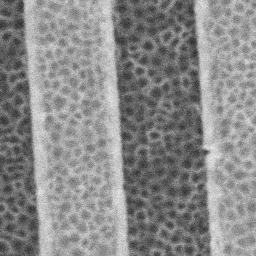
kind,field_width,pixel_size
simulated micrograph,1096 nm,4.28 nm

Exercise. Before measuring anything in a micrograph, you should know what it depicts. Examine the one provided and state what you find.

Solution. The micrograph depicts one or a few lines or trenches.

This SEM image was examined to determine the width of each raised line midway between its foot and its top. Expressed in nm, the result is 337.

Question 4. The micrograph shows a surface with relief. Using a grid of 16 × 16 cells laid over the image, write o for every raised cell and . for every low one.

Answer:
..ooooo.....oooo
..ooooo......ooo
..ooooo......ooo
..ooooo......ooo
..ooooo......ooo
..ooooo......ooo
..ooooo......ooo
..ooooo......ooo
..ooooo......ooo
..ooooo......ooo
..ooooo......ooo
...oooo......ooo
...ooooo.....ooo
...ooooo.....ooo
...ooooo.....ooo
...ooooo.....ooo